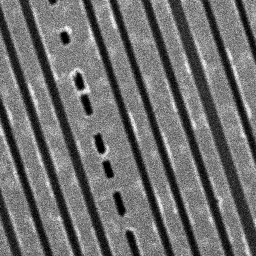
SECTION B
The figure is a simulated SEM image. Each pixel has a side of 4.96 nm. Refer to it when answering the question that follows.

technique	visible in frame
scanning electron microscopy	parallel lines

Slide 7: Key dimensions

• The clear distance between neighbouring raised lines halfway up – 44.3 nm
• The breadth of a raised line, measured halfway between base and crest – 0.0931 µm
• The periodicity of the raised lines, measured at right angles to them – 142 nanometers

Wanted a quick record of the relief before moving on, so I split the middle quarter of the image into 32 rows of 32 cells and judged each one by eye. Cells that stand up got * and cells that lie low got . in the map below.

**********..*****..******..****.
**********..*****..******..*****
***.*******..****..******...****
***..******..****...******..****
***..******..*****..******..****
***..*******..****..******...***
****.*******..****...******..***
*****.******..*****..******..***
****..*******..****..******...**
****...******..****...******..**
*****..******..*****..******..**
*****..*******..****..******...*
.****..*******..****...******..*
.*************..*****..******..*
.**************..****..******...
..*************..****...******..
..*************..*****..******..
..******.******...****..******..
...****..*******..****...******.
...*****..******..*****..******.
...*****..******...****..******.
*...****..*******..****...******
*...*****.*******..*****..******
*...*************...****..******
**...*****.*******..****...*****
**...*****..******..*****..*****
**...*****..******...****..*****
***...****..*******..****...****
***...*****.*******..*****..****
***...*************...****..****
****..**************..****..****
****...*************..*****..***